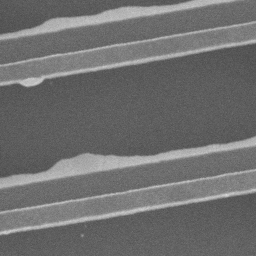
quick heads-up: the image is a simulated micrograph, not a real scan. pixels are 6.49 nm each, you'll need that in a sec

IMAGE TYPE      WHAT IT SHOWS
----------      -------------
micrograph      lines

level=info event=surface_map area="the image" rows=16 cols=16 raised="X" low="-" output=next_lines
-----------XXXXX
----XXXXXXXXXXXX
XXXXXXXXXXXXXXXX
XXXXXXXXXXX-----
XXXXX-----------
----------------
----------------
----------------
----------------
------------XXXX
----XXXXXXXXXXXX
XXXXXXXXXXXXXXXX
XXXXXXXXXXXXX---
XXXXXXX---------
X---------------
----------------